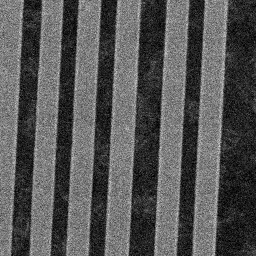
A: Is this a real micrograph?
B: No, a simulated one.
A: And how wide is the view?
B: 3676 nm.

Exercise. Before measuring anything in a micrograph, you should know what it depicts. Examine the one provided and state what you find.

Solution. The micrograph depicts parallel lines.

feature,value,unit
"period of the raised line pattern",587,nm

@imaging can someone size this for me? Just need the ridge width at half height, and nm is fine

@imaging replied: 298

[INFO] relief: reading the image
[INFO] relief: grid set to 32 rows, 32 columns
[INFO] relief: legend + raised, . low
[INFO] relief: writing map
+++..+++..++...++....++...++....
+++..+++..++...++....++...++....
+++..+++..++...++....++...++....
+++..+++..++...++....++...++....
+++..+++..++...++....++...++....
+++..++...++...++....++..+++....
+++..++...++..+++....++..+++....
++...++...++..+++....++..+++....
++...++...++..+++....++..+++....
++...++...++..+++....++..+++....
++...++..+++..+++...+++..+++....
++...++..+++..+++...+++..+++....
++...++..+++..+++...+++..+++....
++...++..+++..+++...+++..+++....
++...++..+++..+++...+++..+++....
++...++..+++..+++...+++..+++....
++...++..+++..+++...+++..+++....
++...++..+++..+++...+++..++.....
++..+++..+++..+++...+++..++.....
++..+++..+++..+++...+++..++.....
++..+++..+++..+++...++...++.....
++..+++..+++..++....++...++.....
++..+++..++...++....++...++.....
++..+++..++...++....++...++.....
++..+++..++...++....++...++.....
++..++...++...++....++...++.....
++..++...++..+++....++...++.....
+...++...++..+++....++..+++.....
+...++...++..+++....++..+++.....
+...++...++..+++....++..+++.....
+...++..+++..+++...+++..+++.....
+...++..+++..+++...+++..+++.....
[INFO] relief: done